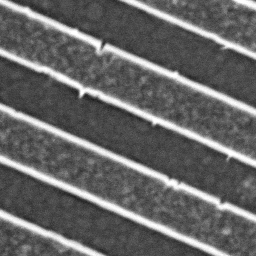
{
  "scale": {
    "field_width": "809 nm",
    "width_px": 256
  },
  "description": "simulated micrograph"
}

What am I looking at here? one or a few lines or trenches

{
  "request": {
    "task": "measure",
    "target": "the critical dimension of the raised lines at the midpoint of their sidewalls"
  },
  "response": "0.155 um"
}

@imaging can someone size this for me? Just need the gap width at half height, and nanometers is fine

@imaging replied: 153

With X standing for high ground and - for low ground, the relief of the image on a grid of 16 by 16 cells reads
X--------XXXXXXX
XXXX-------XXXXX
XXXXXX--------XX
XXXXXXXX--------
---XXXXXXX------
-----XXXXXXXX---
-------XXXXXXXX-
XX--------XXXXXX
XXXX--------XXXX
XXXXXXX-------XX
-XXXXXXXX-------
---XXXXXXXX-----
------XXXXXXX---
--------XXXXXXXX
XXX-------XXXXXX
XXXXX--------XXX